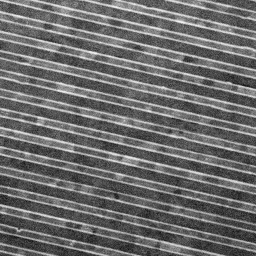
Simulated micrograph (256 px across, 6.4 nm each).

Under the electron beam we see parallel lines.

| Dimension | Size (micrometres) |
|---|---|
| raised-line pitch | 0.12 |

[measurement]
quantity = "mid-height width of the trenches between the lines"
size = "0.0733 µm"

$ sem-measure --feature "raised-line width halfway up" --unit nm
48.3